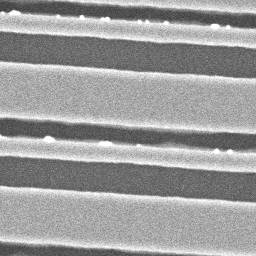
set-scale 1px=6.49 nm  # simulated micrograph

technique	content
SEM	lines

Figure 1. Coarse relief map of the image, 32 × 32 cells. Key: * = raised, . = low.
..............******************
.*...........................***
**************..................
*****************************...
............********************
..........................******
................................
................................
***********.....................
**************************......
********************************
********************************
********************************
********************************
********************************
..............******************
..............................**
*******.........................
**********************..........
...*****************************
...................*************
................................
................................
**..............................
******************..............
********************************
********************************
********************************
********************************
********************************
........************************
.....................***********